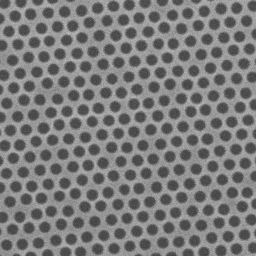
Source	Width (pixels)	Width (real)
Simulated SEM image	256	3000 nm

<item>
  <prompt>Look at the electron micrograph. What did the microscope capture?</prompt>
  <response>a regular array of holes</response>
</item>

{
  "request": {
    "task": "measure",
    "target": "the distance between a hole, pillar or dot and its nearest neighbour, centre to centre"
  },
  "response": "180 nm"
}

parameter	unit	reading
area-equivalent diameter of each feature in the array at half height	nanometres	142